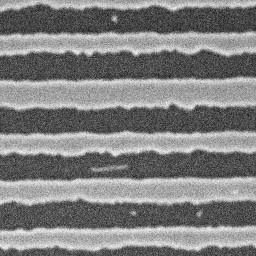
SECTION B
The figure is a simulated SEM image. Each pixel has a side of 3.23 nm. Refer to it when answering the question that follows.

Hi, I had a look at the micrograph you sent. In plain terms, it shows lines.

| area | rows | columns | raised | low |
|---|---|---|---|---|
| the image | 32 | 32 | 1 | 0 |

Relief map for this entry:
11111011111111111111111111111111
00000000000000000000000000000000
00000000000000000000000000000000
00000000000000000000000000000000
11111111111111111111111111111111
11111111111111111111111111111111
11110011011110000110000100011100
00000000000000000000000000000000
00000000000000000000000000000000
00000000000000000000000000000000
11111111111111111111111111111111
11111111111111111111111111111111
11111111111111111111111111111111
01110110001110000000000100000000
00000000000000000000000000000000
00000000000000000000000000000000
00000000000000010000000000001100
11111111111111111111111111111111
11111111111111111111111111111111
00000000000000000000000000000000
00000000000000000000000000000000
00000000000000000000000000000000
00000000001111111011111111111111
11111111111111111111111111111111
11111111111111111111111111111111
00000000000000000000000000000000
00000000000000000000000000000000
00000000000000000000000000000000
00000000000000000011111111111111
11111111111111111111111111111111
11111111111111111111111111111111
00000000000000000000000000000000